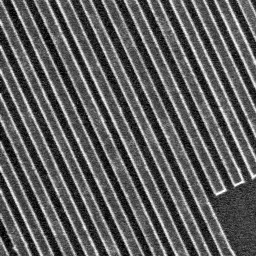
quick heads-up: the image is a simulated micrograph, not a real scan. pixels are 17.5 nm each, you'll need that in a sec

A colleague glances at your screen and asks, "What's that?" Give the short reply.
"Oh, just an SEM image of parallel lines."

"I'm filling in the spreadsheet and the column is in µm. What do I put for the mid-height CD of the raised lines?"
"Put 0.182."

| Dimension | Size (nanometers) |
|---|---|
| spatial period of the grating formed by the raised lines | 356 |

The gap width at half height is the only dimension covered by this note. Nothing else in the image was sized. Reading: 167 nanometres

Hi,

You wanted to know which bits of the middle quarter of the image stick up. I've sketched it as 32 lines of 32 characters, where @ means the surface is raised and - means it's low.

@@@---@@@---@@---@@@---@@@---@@-
-@@@---@@---@@@---@@@--@@@---@@@
-@@@---@@@---@@---@@@---@@@--@@@
--@@@--@@@---@@@---@@@--@@@---@@
--@@@---@@@---@@---@@@---@@---@@
---@@@--@@@---@@@---@@---@@@---@
---@@@---@@@---@@---@@@---@@@--@
@---@@@--@@@---@@@---@@---@@@---
@---@@@---@@@--@@@---@@@--@@@---
@@---@@---@@@---@@@---@@---@@@--
@@---@@@---@@@---@@---@@@---@@--
@@@--@@@---@@@---@@@--@@@---@@@-
@@@---@@@--@@@---@@@---@@@--@@@-
-@@@--@@@---@@@---@@---@@@---@@@
-@@@---@@@--@@@---@@@---@@@--@@@
--@@@--@@@---@@@---@@---@@@---@@
--@@@---@@@--@@@---@@@---@@@--@@
---@@@--@@@---@@@---@@---@@@---@
---@@@---@@@--@@@---@@@---@@@--@
@---@@---@@@---@@@---@@---@@@---
@---@@@---@@@--@@@---@@@---@@---
@@--@@@---@@@---@@@---@@---@@@--
@@---@@@---@@@--@@@---@@@---@@--
@@@--@@@---@@@---@@@---@@---@@@-
-@@---@@@---@@@--@@@---@@@---@@-
-@@@--@@@---@@@---@@@---@@---@@@
-@@@---@@@--@@@@--@@@---@@@---@@
--@@---@@@---@@@--@@@---@@@---@@
--@@@---@@@--@@@---@@@---@@---@@
---@@---@@@---@@@--@@@---@@@---@
---@@@---@@@--@@@---@@@---@@---@
@---@@---@@@---@@@--@@@---@@@---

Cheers